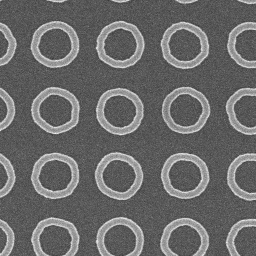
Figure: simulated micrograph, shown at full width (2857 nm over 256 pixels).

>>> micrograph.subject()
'a regular array of ring-shaped raised bodies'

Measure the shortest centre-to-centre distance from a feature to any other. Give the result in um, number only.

0.724